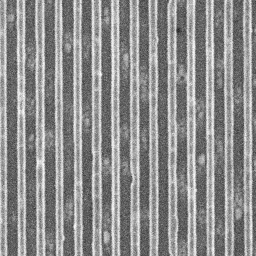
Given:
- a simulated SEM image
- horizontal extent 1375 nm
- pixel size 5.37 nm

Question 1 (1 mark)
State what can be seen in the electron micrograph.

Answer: parallel lines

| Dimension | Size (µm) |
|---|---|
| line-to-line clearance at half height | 0.0624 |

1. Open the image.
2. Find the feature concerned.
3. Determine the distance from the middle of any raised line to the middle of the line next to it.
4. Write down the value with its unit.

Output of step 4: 101 nanometers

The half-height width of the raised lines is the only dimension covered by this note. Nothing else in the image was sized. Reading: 0.0383 microns